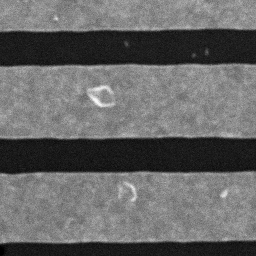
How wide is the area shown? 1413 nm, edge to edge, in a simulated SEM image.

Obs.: wiring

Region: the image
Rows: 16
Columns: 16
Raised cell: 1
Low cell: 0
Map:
1111111111111111
1111111111111111
0000000000000000
0000000000000000
1111111111111111
1111111111111111
1111111111111111
1111111111111111
1111111111111011
0000000000000000
0000000000000000
1111111111111111
1111111111111111
1111111111111111
1111111111111111
0000000000000000